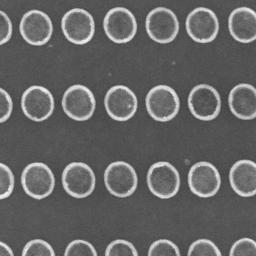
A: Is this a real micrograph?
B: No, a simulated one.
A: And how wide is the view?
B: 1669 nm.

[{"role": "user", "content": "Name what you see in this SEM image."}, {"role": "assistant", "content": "a regular array of raised bodies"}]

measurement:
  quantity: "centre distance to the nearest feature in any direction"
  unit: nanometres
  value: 268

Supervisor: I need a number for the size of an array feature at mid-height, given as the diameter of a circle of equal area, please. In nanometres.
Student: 204